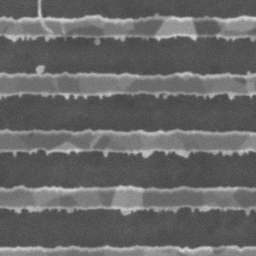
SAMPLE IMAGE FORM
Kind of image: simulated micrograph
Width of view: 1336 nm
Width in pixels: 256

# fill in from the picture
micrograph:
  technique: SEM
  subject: lines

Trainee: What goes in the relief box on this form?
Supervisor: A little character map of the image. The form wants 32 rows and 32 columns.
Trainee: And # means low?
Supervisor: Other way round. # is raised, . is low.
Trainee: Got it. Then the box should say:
................................
................................
################################
################################
.####.################.#########
................................
................................
................................
................................
################################
################################
################################
................................
................................
................................
................................
#########.#####.##.######....#..
################################
################################
................................
................................
................................
................................
..#..##.......###.....##...#.##.
################################
################################
................................
................................
................................
................................
................................
################################